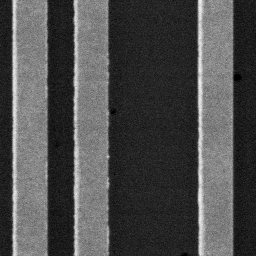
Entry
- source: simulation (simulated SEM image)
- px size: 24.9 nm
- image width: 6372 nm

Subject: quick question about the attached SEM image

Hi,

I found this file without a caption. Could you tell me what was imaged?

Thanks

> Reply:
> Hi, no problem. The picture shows lines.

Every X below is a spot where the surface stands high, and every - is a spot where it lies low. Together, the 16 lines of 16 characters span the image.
-XX--XX------XX-
-XX--XX------XX-
-XX--XX------XX-
-XX--XX------XX-
-XX--XX------XX-
-XX--XX------XX-
-XX--XX------XX-
-XX--XX------XX-
-XX--XX------XX-
-XX--XX------XX-
-XX--XX------XX-
-XX--XX------XX-
-XX--XX------XX-
-XX--XX------XX-
-XX--XX------XX-
-XX--XX------XX-